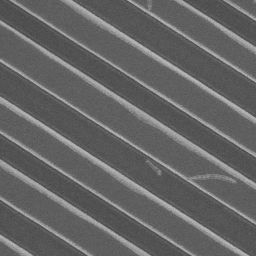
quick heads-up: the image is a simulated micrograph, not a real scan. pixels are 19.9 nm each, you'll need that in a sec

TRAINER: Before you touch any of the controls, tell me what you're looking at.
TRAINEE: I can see lines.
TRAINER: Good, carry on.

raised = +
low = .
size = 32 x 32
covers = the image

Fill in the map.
..+++++++........++++++......+++
....+++++++.......+++++++.....++
.....+++++++........++++++......
+......+++++++.......+++++++....
+++.....++++++++.......+++++++..
+++++.....+++++++.......+++++++.
++++++.....++++++++.......++++++
+++++++......+++++++........++++
.++++++++......+++++++.......+++
...++++++++.....++++++++.......+
....++++++++......+++++++.......
......++++++++.....++++++++.....
+.......+++++++......+++++++....
++.......++++++++.....++++++++..
++++.......+++++++......+++++++.
+++++.......++++++++.....+++++++
+++++++.......+++++++......+++++
.+++++++........+++++++......+++
...+++++++.......++++++++.....++
.....++++++........+++++++......
+.....+++++++.......++++++++....
++......++++++........+++++++...
++++.....+++++++.......++++++++.
+++++......+++++++.......+++++++
+++++++.....+++++++.......++++++
.+++++++......+++++++.......++++
...+++++++.....+++++++........++
....++++++++.....+++++++.......+
......+++++++......++++++.......
.......++++++++.....+++++++.....
++.......+++++++......+++++++...
+++.......++++++++.....+++++++..